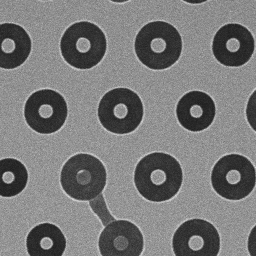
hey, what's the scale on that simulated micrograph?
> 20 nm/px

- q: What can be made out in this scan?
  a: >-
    ring-shaped grooves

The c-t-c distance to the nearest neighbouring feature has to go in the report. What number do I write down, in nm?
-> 1500